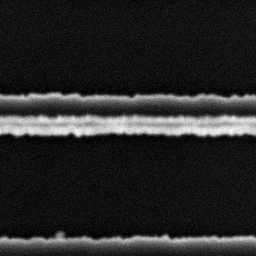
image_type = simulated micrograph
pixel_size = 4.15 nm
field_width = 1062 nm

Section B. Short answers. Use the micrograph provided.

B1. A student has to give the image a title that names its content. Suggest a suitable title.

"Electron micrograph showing lines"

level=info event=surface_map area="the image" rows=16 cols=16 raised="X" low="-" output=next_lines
----------------
----------------
----------------
----------------
----------------
----------------
XXXXXXXXXXXXXXXX
XXXXXXXXXXXXXXXX
----------------
----------------
----------------
----------------
----------------
----------------
----------------
XXXXXXXXXXXXXXXX